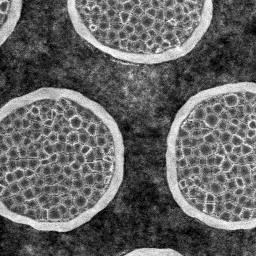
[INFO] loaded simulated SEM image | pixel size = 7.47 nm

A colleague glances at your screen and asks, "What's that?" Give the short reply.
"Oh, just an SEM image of raised bodies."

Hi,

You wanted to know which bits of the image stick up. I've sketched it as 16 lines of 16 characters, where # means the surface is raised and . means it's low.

#....########...
#....########...
......######....
........##......
................
...............#
.#####......####
#######....#####
#######....#####
#######....#####
#######....#####
#######....#####
#######....#####
.####........###
................
................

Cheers